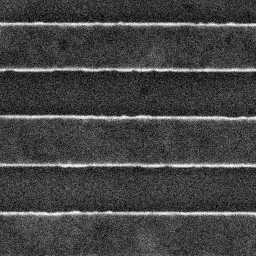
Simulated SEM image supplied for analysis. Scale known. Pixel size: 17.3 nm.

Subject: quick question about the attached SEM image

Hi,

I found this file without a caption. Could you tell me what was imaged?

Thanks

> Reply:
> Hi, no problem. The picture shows lines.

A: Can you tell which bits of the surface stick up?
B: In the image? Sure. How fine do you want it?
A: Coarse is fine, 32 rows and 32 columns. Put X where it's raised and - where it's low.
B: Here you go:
--------------------------------
--------------------------------
--------------------------------
XXXXXXXXXXXXXXXXXXXXXXXXXXXXXXXX
XXXXXXXXXXXXXXXXXXXXXXXXXXXXXXXX
XXXXXXXXXXXXXXXXXXXXXXXXXXXXXXXX
XXXXXXXXXXXXXXXXXXXXXXXXXXXXXXXX
XXXXXXXXXXXXXXXXXXXXXXXXXXXXXXXX
XXXXXXXXXXXXXXXXXXXXXXXXXXXXXXXX
--------------------------------
--------------------------------
--------------------------------
--------------------------------
--------------------------------
--------------------------------
XXXXXXXXXXXXXXXXXXXXXXXXXXXXXXXX
XXXXXXXXXXXXXXXXXXXXXXXXXXXXXXXX
XXXXXXXXXXXXXXXXXXXXXXXXXXXXXXXX
XXXXXXXXXXXXXXXXXXXXXXXXXXXXXXXX
XXXXXXXXXXXXXXXXXXXXXXXXXXXXXXXX
XXXXXXXXXXXXXXXXXXXXXXXXXXXXXXXX
--------------------------------
--------------------------------
--------------------------------
--------------------------------
--------------------------------
--------------------------------
XXXXXXXXXXXXXXXXXXXXXXXXXXXXXXXX
XXXXXXXXXXXXXXXXXXXXXXXXXXXXXXXX
XXXXXXXXXXXXXXXXXXXXXXXXXXXXXXXX
XXXXXXXXXXXXXXXXXXXXXXXXXXXXXXXX
XXXXXXXXXXXXXXXXXXXXXXXXXXXXXXXX